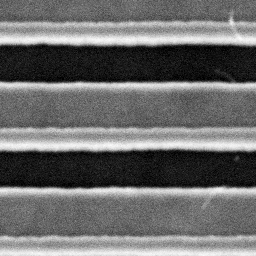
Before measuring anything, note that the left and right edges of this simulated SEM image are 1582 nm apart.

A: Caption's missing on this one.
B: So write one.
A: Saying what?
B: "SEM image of lines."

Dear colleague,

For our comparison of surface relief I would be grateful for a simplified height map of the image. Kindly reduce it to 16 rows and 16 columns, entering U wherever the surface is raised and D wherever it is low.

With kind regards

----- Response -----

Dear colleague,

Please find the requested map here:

UUUUUUUUUUUUUUUU
UUUUUUUUUUUUUUUU
UUUUUUUUUUUUUUUU
DDDDDDDDDDDDDDDD
DDDDDDDDDDDDDDDD
UUUUUUUUUUUUUUUU
UUUUUUUUUUUUUUUU
UUUUUUUUUUUUUUUU
UUUUUUUUUUUUUUUU
DDDDDDDDDDDDDDDD
DDDDDDDDDDDDDDDD
DDDDDDDDDDDDDDDD
UUUUUUUUUUUUUUUU
UUUUUUUUUUUUUUUU
UUUUUUUUUUUUUUUU
UUUUUUUUUUUUUUUU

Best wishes